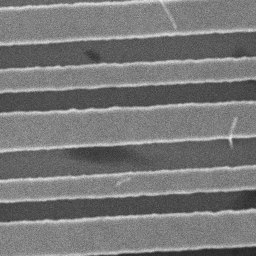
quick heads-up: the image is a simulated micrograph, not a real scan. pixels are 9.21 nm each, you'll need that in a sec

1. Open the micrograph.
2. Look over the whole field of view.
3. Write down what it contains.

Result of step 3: lines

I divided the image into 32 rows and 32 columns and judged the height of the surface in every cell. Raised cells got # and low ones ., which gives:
.........#######################
################################
################################
################################
####################............
####............................
................................
.......................#.#######
....############################
################################
######################..........
#...............................
................................
..............##################
################################
################################
################################
###########################.#...
########........................
................................
................................
...................#############
.###############################
################################
################................
................................
.........................#.#####
.....###########################
################################
################################
################################
##################..............